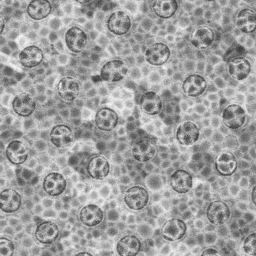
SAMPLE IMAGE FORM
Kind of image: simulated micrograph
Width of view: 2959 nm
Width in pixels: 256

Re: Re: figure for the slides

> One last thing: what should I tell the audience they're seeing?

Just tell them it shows a regular array of holes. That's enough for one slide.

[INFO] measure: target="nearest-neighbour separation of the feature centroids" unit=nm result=544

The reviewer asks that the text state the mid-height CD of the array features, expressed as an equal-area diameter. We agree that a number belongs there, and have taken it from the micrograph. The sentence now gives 22.9 px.